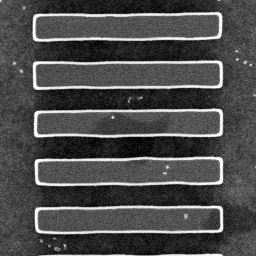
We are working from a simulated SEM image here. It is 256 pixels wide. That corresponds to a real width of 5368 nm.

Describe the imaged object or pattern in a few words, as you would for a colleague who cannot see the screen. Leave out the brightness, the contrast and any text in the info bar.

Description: groups of lines, slits or small figures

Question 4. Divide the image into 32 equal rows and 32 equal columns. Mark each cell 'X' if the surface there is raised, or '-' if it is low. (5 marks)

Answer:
--------------------------------
--------------------------------
----XXXXXXXXXXXXXXXXXXXXXXXX----
----XXXXXXXXXXXXXXXXXXXXXXXX----
----XXXXXXXXXXXXXXXXXXXXXXX-----
--------------------------------
--------------------------------
--------------------------------
----XXXXXXXXXXXXXXXXXXXXXXXX----
----XXXXXXXXXXXXXXXXXXXXXXXX----
----XXXXXXXXXXXXXXXXXXXXXXX-----
--------------------------------
--------------------------------
--------------------------------
-----XXXXXXXXXXXXXXXXXXXXXXX----
-----XXXXXXXXXXXXXXXXXXXXXXX----
----XXXXXXXXXXXXXXXXXXXXXXX-----
--------------------------------
--------------------------------
--------------------------------
-----XXXXXXXXXXXXXXXXXXXXXXX----
-----XXXXXXXXXXXXXXXXXXXXXXX----
-----XXXXXXXXXXXXXXXXXXXXXXX----
--------------------------------
--------------------------------
--------------------------------
-----XXXXXXXXXXXXXXXXXXXXXXX----
-----XXXXXXXXXXXXXXXXXXXXXXX----
-----XXXXXXXXXXXXXXXXXXXXXXX----
--------------------------------
--------------------------------
--------------------------------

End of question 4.